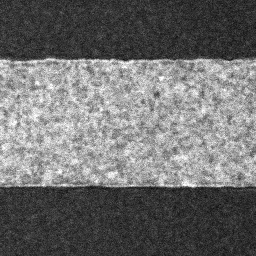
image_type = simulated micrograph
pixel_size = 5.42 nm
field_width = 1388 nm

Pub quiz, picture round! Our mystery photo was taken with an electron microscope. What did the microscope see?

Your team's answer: one or a few lines or trenches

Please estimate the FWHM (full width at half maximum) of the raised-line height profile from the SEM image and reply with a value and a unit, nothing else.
676 nm